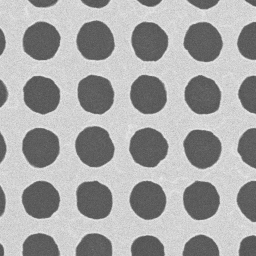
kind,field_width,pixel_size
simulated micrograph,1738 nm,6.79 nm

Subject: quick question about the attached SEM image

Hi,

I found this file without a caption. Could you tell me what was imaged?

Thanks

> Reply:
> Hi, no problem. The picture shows a regular array of holes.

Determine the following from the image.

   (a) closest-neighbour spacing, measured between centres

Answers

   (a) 357 nanometres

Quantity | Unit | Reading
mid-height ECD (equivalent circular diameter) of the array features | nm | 260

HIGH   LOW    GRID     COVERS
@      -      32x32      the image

@@@@---@@@@--@@@@@--@@@@---@@@@-
@@@@@@@@@@@@@@@@@@@@@@@@@@@@@@@@
@@@@@@@@@@@@@@@@@@@@@@@@@@@@@@@@
@@@@---@@@----@@@---@@@@---@@@--
-@@----@@@----@@-----@@-----@@--
-@@----@@@----@@-----@@-----@@--
@@@----@@@----@@@----@@-----@@--
@@@@@@@@@@@--@@@@@--@@@@@--@@@@@
@@@@@@@@@@@@@@@@@@@@@@@@@@@@@@@@
@@@@@@@@@@@-@@@@@@-@@@@@@@@@@@@-
@@@----@@@----@@@---@@@----@@@--
-@@----@@@----@@-----@@-----@@--
-@@-----@@----@@-----@@-----@@--
@@@@---@@@----@@@---@@@@---@@@@-
@@@@@@@@@@@@@@@@@@@@@@@@@@@@@@@@
@@@@@@@@@@@@@@@@@@@@@@@@@@@@@@@@
@@@@--@@@@---@@@@---@@@@--@@@@@-
-@@----@@-----@@-----@@----@@@--
-@@----@@-----@@-----@@-----@@--
-@@----@@@----@@-----@@----@@@--
@@@@--@@@@@--@@@@---@@@@---@@@@-
@@@@@@@@@@@@@@@@@@@@@@@@@@@@@@@@
@@@@@@@@@@@@@@@@@@@@@@@@@@@@@@@@
@@@----@@@---@@@@---@@@----@@@--
-@@----@@@----@@-----@@----@@@--
-@@----@@@----@@-----@@----@@@--
@@@----@@@----@@@---@@@----@@@--
@@@@@@@@@@@@@@@@@@-@@@@@@@@@@@@-
@@@@@@@@@@@@@@@@@@@@@@@@@@@@@@@@
@@@@--@@@@@--@@@@@-@@@@@@-@@@@@-
@@@----@@@----@@@---@@@----@@@--
@@@----@@-----@@-----@@----@@@--